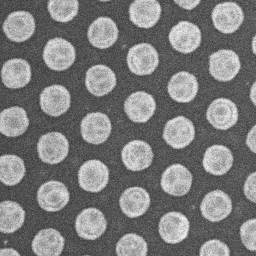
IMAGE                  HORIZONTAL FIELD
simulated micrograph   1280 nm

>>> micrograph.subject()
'a regular array of raised bodies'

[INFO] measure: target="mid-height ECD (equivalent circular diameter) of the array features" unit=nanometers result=153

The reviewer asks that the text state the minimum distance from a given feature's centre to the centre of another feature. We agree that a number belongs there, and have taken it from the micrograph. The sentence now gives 233 nanometres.